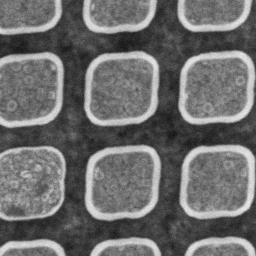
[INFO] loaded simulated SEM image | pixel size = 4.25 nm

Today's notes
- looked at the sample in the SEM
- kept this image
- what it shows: raised bodies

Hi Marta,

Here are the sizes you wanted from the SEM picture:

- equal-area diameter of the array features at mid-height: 73.2 px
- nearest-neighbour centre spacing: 93.7 pixels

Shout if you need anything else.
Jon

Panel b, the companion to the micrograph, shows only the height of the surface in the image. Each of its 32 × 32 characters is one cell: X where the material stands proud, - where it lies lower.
XXXXXXX----XXXXXXXX----XXXXXXXX-
XXXXXXX----XXXXXXXX----XXXXXXXX-
XXXXXXX----XXXXXXX-----XXXXXXX--
XXXXXX------XXXX--------XXXX----
--------------------------------
--------------------------------
--------------------------------
-XXXXXX-----XXXXXXX-----XXXXXXX-
XXXXXXXX---XXXXXXXX----XXXXXXXX-
XXXXXXXX---XXXXXXXX----XXXXXXXX-
XXXXXXXX---XXXXXXXX----XXXXXXXX-
XXXXXXX----XXXXXXXX----XXXXXXXX-
XXXXXXX----XXXXXXXX----XXXXXXXX-
XXXXXXX----XXXXXXXX----XXXXXXXX-
XXXXXX-----XXXXXXX-----XXXXXXX--
-XX-----------------------------
--------------------------------
--------------------------------
--------------------------------
------------XXXXXXX-----XXXXXXX-
X---X------XXXXXXXXX---XXXXXXXX-
XXXXX------XXXXXXXXX---XXXXXXXX-
-XXXXX-----XXXXXXXX----XXXXXXXXX
-XXXX------XXXXXXXX----XXXXXXXX-
XXXXXX-----XXXXXXXX----XXXXXXXX-
XXX--------XXXXXXXX----XXXXXXXX-
XX----------XXXXXX------XXXXXX--
--------------------------------
--------------------------------
--------------------------------
----XX-------XXXXXX------XXXXXX-
XXXXXXX-----XXXXXXXX----XXXXXXX-